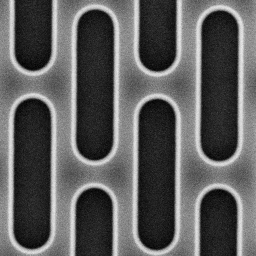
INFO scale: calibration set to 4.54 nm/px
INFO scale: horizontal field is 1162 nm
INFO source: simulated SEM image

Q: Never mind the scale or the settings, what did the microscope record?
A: groups of lines, slits or small figures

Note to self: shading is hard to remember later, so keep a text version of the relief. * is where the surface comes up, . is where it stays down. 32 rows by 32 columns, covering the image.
**.....**********.....**********
**.....***....***.....****...***
**.....***....***.....***.....**
**.....**......**.....***.....**
**.....**......**.....***.....**
**.....**......**.....***.....**
**.....**......**.....***.....**
**....***......**.....***.....**
***...***......***...****.....**
*********......**********.....**
*********......**********.....**
*********......**********.....**
***...***......***...****.....**
**....***......**.....***.....**
**.....**......**.....***.....**
*......**......**.....***.....**
*......**......**.....***.....**
*......**......**.....***.....**
*......**.....***.....***.....**
*......***....***.....***....***
*......**********.....**********
*......**********.....**********
*......**********.....**********
*......****..****.....****..****
*......***....***.....***....***
*......**.....***.....***.....**
*......**.....***.....***.....**
*......**.....***.....***.....**
*......**.....***.....***.....**
**....***.....***.....***.....**
**....***.....****....***.....**
*********.....*****.*****.....**